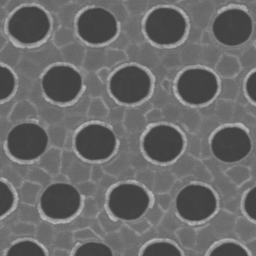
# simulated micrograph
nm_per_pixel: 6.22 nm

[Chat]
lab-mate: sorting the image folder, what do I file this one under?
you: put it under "a regular array of holes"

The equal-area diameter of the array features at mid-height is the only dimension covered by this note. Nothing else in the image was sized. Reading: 234 nanometers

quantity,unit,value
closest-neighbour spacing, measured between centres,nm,419